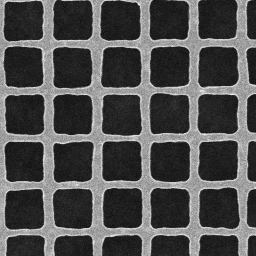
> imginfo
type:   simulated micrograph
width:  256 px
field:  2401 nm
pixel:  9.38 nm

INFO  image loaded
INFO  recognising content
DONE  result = a regular array of holes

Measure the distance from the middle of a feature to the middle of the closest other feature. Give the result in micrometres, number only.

0.439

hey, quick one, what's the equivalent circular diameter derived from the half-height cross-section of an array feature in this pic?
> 411 nm